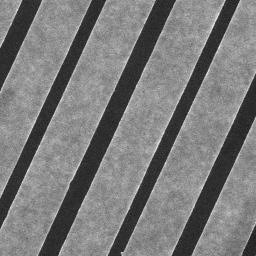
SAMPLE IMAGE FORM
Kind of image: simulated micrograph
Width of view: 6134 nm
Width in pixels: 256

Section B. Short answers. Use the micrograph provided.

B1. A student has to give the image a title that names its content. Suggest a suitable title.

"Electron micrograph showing parallel lines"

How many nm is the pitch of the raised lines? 1450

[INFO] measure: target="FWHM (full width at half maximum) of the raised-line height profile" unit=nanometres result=1070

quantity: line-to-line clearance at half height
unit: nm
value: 348